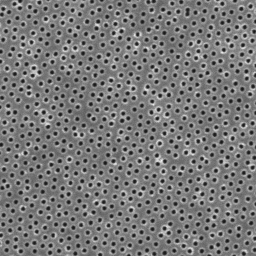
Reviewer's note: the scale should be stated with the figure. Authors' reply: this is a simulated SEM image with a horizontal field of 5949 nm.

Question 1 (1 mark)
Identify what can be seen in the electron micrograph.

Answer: a regular array of holes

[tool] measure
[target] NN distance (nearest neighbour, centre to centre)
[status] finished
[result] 192 nm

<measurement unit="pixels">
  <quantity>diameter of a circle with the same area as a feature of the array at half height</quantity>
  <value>4.51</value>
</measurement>